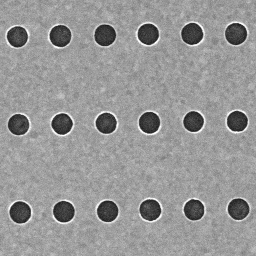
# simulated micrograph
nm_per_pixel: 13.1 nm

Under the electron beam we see a regular array of holes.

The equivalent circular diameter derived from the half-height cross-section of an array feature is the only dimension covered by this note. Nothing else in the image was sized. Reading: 289 nm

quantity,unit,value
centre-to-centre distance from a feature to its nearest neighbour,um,0.568